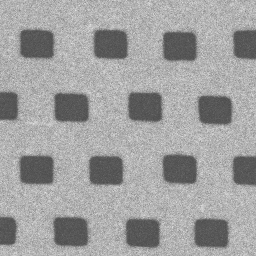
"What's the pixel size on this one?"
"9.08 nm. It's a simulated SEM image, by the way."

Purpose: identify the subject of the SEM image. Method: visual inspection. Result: a regular array of holes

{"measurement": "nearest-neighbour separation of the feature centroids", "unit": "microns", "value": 0.628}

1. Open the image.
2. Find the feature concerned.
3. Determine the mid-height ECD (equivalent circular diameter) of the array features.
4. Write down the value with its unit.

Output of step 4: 310 nanometers